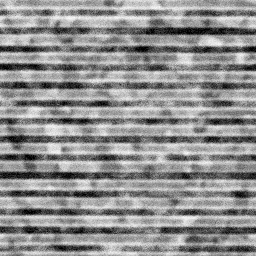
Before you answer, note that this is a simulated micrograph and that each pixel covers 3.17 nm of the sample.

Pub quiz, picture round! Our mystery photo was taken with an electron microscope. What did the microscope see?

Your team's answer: parallel lines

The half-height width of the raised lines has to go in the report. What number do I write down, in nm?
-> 29.3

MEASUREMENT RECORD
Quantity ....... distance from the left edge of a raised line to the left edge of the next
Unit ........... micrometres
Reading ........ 0.0575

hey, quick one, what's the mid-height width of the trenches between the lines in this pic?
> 26.6 nm